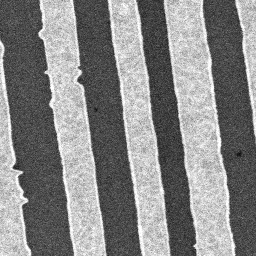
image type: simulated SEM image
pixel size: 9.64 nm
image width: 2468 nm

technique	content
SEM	one or a few lines or trenches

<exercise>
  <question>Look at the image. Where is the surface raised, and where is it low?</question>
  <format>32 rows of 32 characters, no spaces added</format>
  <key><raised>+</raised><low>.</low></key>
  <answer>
.....++++.....+++....++++.....++
.....++++.....+++....++++.....++
.....++++.....+++....++++.....++
.....++++.....+++....+++++....++
.....+++++....++++...+++++.....+
......++++....++++...+++++....++
......++++....++++...+++++.....+
......++++.....+++...+++++.....+
......++++.....+++....++++.....+
......++++.....+++....++++.....+
......++++.....++++...+++++....+
+......+++.....++++...+++++....+
+......++++....++++...+++++....+
+......++++....++++...+++++.....
+......++++.....+++...+++++.....
+......++++.....+++....++++.....
+......++++.....+++....++++.....
+......++++.....+++....++++.....
+......++++.....++++...++++.....
++......++++....++++...+++++....
++......++++....++++...+++++....
++......++++.....+++...+++++....
++......++++.....+++....++++....
++......++++.....+++....++++....
+++.....++++.....+++....+++++...
+++......+++.....++++...++++....
+++......+++.....++++...++++....
+++......++++....++++...+++++...
+++......++++....++++...+++++...
+++......++++.....+++....++++...
+++......++++.....+++...+++++...
++++.....++++.....+++....++++...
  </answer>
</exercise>